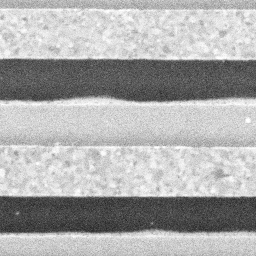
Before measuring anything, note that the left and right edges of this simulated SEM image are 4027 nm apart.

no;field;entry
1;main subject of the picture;lines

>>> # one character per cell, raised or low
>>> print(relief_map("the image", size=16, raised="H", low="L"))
HHHHHHHHHHHHHHHH
HHHHHHHHHHHHHHHH
HHHHHHHHHHHHHHHH
HHHHHHHHHHHHHHHH
LLLLLLLLLLLLLLLL
LLLLLLLLLLLLLLLL
LLLLLLHLLLLLLLLL
HHHHHHHHHHHHHHHH
HHHHHHHHHHHHHHHH
HHHHHHHHHHHHHHHH
HHHHHHHHHHHHHHHH
HHHHHHHHHHHHHHHH
LLLLLLLLLLLLLLLL
LLLLLLLLLLLLLLLL
LLLLLLLLLLLLLLLL
HHHHHHHHHHHHHHHH